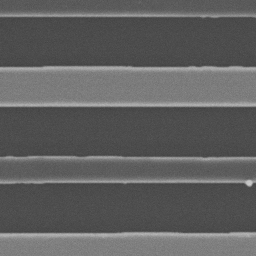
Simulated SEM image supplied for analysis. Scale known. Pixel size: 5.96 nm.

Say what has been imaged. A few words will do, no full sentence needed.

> lines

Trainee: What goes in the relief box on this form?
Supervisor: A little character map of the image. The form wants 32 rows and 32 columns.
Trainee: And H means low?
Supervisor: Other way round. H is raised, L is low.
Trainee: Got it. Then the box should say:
HHHHHHHHHHHHHHHHHHHHHHHHHHHHHHHH
HHHHHHHHHHHHHHHHHHHHHHHHHHHHHHHH
LLLLLLLLLLLLLLLLLLLLLLLLLLLLLLLL
LLLLLLLLLLLLLLLLLLLLLLLLLLLLLLLL
LLLLLLLLLLLLLLLLLLLLLLLLLLLLLLLL
LLLLLLLLLLLLLLLLLLLLLLLLLLLLLLLL
LLLLLLLLLLLLLLLLLLLLLLLLLLLLLLLL
LLLLLLLLLLLLLLLLLLLLLLLLLLLLLLLL
HHHHHHHHHHHHHHHHHHHHHHHHHHHHHHHH
HHHHHHHHHHHHHHHHHHHHHHHHHHHHHHHH
HHHHHHHHHHHHHHHHHHHHHHHHHHHHHHHH
HHHHHHHHHHHHHHHHHHHHHHHHHHHHHHHH
HHHHHHHHHHHHHHHHHHHHHHHHHHHHHHHH
LLLLLLLLLLLLLLLLLLLLLLLLLLLLLLLL
LLLLLLLLLLLLLLLLLLLLLLLLLLLLLLLL
LLLLLLLLLLLLLLLLLLLLLLLLLLLLLLLL
LLLLLLLLLLLLLLLLLLLLLLLLLLLLLLLL
LLLLLLLLLLLLLLLLLLLLLLLLLLLLLLLL
LLLLLLLLLLLLLLLLLLLLLLLLLLLLLLLL
LLLLLLLLLLLLLLLLLLLLLLLLLLLLLLLL
HHHHHHHHHHHHHHHHHHHHHHHHHHHHHHHH
HHHHHHHHHHHHHHHHHHHHHHHHHHHHHHHH
HHHHHHHHHHHHHHHHHHHHHHHHHHHHHHHH
LLLLLLLLLLLLLLLLLLLLLLLLLLLLLLLL
LLLLLLLLLLLLLLLLLLLLLLLLLLLLLLLL
LLLLLLLLLLLLLLLLLLLLLLLLLLLLLLLL
LLLLLLLLLLLLLLLLLLLLLLLLLLLLLLLL
LLLLLLLLLLLLLLLLLLLLLLLLLLLLLLLL
LLLLLLLLLLLLLLLLLLLLLLLLLLLLLLLL
HHHHHHHHHHHHHHHHHHHHHHHHHHHHHHHH
HHHHHHHHHHHHHHHHHHHHHHHHHHHHHHHH
HHHHHHHHHHHHHHHHHHHHHHHHHHHHHHHH